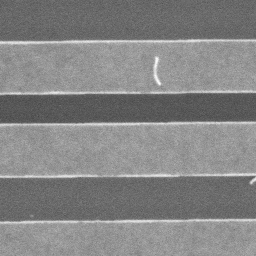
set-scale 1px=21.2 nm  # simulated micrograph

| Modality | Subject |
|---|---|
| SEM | lines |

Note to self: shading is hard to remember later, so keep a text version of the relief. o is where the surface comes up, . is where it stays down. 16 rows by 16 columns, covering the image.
................
................
................
oooooooooooooooo
oooooooooooooooo
oooooooooooooooo
................
................
oooooooooooooooo
oooooooooooooooo
oooooooooooooooo
................
................
................
oooooooooooooooo
oooooooooooooooo